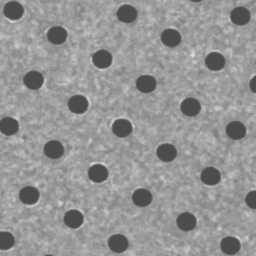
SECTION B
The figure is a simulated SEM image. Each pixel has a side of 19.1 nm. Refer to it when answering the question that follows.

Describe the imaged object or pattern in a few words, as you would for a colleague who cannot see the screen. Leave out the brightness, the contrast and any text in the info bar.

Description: a regular array of holes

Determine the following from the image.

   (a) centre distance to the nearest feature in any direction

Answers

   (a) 961 nm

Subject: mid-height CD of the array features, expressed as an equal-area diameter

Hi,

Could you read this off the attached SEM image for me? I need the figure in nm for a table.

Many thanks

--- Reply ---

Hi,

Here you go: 385